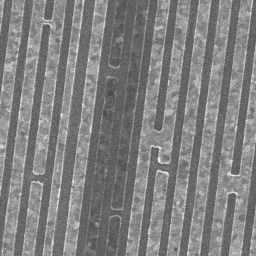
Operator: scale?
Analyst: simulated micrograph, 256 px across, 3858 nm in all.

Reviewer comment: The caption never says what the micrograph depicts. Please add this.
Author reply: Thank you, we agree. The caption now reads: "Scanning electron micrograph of parallel lines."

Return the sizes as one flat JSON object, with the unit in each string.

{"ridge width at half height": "179 nm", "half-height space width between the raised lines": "0.138 um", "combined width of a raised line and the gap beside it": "309 nm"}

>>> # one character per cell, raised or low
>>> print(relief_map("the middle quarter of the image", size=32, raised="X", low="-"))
-XX---XXX---XX--XXX--XXX---XX---
-XX---XXX-------XXX--XXX--XXX---
-X----XXX-------XXX--XXX--XXX--X
-X----XX---XX---XXX--XXX--XXX--X
XX---XXX---XX---XXX--XXX--XXX--X
XX---XXX---XX---XXX--XXX--XXX--X
XX---XXX--XXX--XXX---XX---XXX--X
XX---XXX--XXX--XXX---XX---XXX--X
XX---XXX--XXX--XXX--XXX---XX---X
XX---XXX--XXX--XXX--XXX--XXX---X
X----XX---XXX--XXX--XXX--XXX--XX
X---XXX---XX---XXX--XXX--XXX--XX
X---XXX---XX---XX---XXX--XXX--XX
X---XXX---XX---XX---XX---XXX--XX
X---XXX--XXX--XXX---XX---XXX--XX
X---XXX--XXX--XXX---XX---XXX--XX
X---XXX--XXX--XXX--XXXX-XXX---XX
X---XXX--XXX--XXX--XXXXXXXX---XX
----XX---XXX--XXX--XXXXXXXX---XX
---XXX---XXX--XXX--XXXXXXXX---XX
---XXX--XXXX--XX---XXXXXXXX--XXX
---XXX--XXX---XX---XXX--XXX--XXX
---XXX--XXX---XX---XXX--XXX--XXX
---XXX--XXX--XXX---XX---XXX--XXX
---XXX--XXX--XXX--XXX---XX---XXX
---XXX--XXX--XXX--XXX--------XX-
---XX---XXX--XXX--XXX--------XX-
--XXX---XX---XXX--XXX--XXX--XXX-
--XXX---XX---XX---XXX--XXX--XXX-
--XXX---XX---XX---XXX--XXX--XXX-
--XXX--XXX--XXX---XXX--XXX--XXX-
--XXX--XXX--XXX---XX---XXX--XXX-